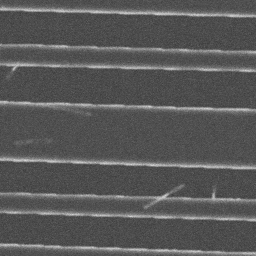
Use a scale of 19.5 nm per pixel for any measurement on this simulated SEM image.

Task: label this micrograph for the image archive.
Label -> lines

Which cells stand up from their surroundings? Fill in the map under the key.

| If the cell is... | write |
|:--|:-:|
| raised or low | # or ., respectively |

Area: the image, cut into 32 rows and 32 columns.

################################
............####################
................................
................................
................................
................................
################################
################################
...............#################
................................
................................
................................
................................
######################..........
################################
################################
################################
################################
################################
################################
................################
................................
................................
................................
############....................
################################
################################
...............................#
................................
................................
................................
############################....